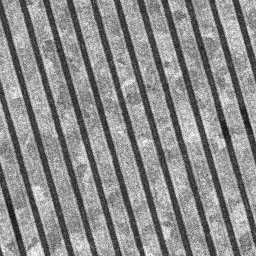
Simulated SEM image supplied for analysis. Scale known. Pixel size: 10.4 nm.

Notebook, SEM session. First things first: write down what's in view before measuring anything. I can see parallel lines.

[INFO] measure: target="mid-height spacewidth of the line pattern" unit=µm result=0.0917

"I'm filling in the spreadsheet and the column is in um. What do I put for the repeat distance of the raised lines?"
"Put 0.238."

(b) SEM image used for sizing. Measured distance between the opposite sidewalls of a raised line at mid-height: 0.152 micrometres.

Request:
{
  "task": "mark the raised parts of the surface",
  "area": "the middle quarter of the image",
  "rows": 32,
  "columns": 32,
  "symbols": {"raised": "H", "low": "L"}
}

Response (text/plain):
LHHHHLLHHHHLLHHHHLLHHHHLLHHHHLLH
LLHHHLLHHHHLLHHHHLLHHHHLLHHHHLLH
LLHHHHLLHHHLLLHHHLLLHHHLLLHHHLLH
LLHHHHLLHHHHLLHHHLLLHHHHLLHHHLLL
LLHHHHLLHHHHLLHHHHLLHHHHLLHHHHLL
HLLHHHLLHHHHLLLHHHLLHHHHLLHHHHLL
HLLHHHHLLHHHHLLHHHLLLHHHLLLHHHLL
HLLHHHHLLHHHHLLHHHHLLHHHHLLHHHHL
HLLLHHHLLHHHHLLHHHHLLHHHHLLHHHHL
HHLLHHHHLLHHHLLLHHHLLLHHHLLLHHHL
HHLLHHHHLLHHHHLLHHHLLLHHHHLLHHHL
HHLLHHHHLLHHHHLLHHHHLLHHHHLLHHHH
HHHLLHHHLLHHHHLLLHHHLLHHHHLLHHHH
HHHLLHHHHLLHHHHLLHHHLLLHHHLLLHHH
HHHLLHHHHLLHHHHLLHHHHLLHHHHLLHHH
HHHLLLHHHLLHHHHLLHHHHLLHHHHLLHHH
HHHHLLHHHHLLHHHLLLHHHLLLHHHLLLHH
HHHHLLHHHHLLHHHHLLHHHLLLHHHHLLHH
LHHHLLLHHHLLHHHHLLHHHHLLHHHHLLHH
LHHHLLLHHHLLLHHHLLLHHHLLHHHHLLHH
LHHHHLLHHHHLLHHHHLLHHHLLLHHHLLLH
LHHHHLLHHHHLLHHHHLLHHHHLLHHHHLLH
LLHHHLLLHHHLLHHHHLLHHHHLLHHHHLLH
LLHHHHLLHHHHLLHHHLLLHHHLLLHHHLLL
LLHHHHLLHHHHLLHHHHLLHHHLLLHHHHLL
LLLHHHLLHHHHLLHHHHLLHHHHLLHHHHLL
HLLHHHHLLHHHLLLHHHLLLHHHLLHHHHLL
HLLHHHHLLHHHHLLHHHHLLHHHLLLHHHLL
HLLHHHHLLHHHHLLHHHHLLHHHHLLHHHHL
HLLLHHHLLLHHHLLHHHHLLHHHHLLHHHHL
HHLLHHHHLLHHHHLLHHHLLLHHHLLLHHHL
HHLLHHHHLLHHHHLLHHHHLLHHHHLLHHHH